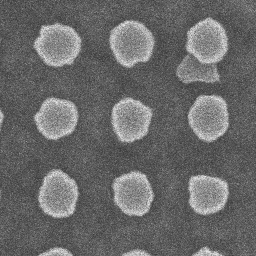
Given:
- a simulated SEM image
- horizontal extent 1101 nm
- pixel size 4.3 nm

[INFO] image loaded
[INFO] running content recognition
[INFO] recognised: a regular array of raised bodies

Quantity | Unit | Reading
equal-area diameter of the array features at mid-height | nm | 174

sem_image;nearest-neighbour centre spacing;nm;318